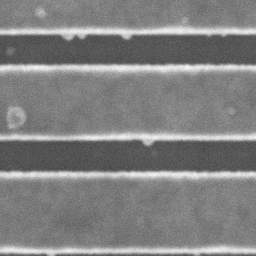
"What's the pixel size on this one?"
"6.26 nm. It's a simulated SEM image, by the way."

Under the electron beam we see lines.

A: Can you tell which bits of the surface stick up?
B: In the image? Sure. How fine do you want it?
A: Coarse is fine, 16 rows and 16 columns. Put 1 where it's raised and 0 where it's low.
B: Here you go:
1111111111111111
1111111111111111
0000000000000000
0000000000000000
1111111111111111
1111111111111111
1111111111111111
1111111111111111
1111111111111111
0000000000000000
0000000000000000
1111111111111111
1111111111111111
1111111111111111
1111111111111111
1111111111111111